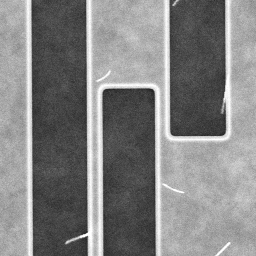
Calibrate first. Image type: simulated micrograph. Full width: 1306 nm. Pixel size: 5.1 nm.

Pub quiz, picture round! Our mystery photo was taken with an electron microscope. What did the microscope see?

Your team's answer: groups of lines, slits or small figures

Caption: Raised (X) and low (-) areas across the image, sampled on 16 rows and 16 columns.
XX----XXXX----XX
XX----XXXX----XX
XX----XXXX----XX
XX----XXXX----XX
XX----XXXX----XX
XX----X--X----XX
XX------------XX
XX------------XX
XX--------X---XX
XX--------XXXXXX
XX--------XXXXXX
XX--------XXXXXX
XX--------XXXXXX
XX--------XXXXXX
XX--------XXXXXX
XX--------XXXXXX